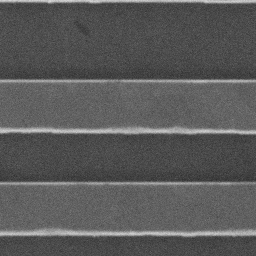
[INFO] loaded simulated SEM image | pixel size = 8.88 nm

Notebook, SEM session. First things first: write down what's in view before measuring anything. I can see lines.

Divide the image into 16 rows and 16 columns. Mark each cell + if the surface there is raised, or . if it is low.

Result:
................
................
................
................
................
++++++++++++++++
++++++++++++++++
++++++++++++++++
................
................
................
++++++++++++++++
++++++++++++++++
++++++++++++++++
++++++++++++++++
................